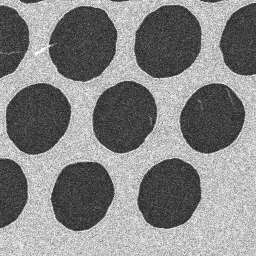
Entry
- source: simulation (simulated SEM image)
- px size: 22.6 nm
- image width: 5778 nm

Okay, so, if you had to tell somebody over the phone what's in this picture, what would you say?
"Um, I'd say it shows holes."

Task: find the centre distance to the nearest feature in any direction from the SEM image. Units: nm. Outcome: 1950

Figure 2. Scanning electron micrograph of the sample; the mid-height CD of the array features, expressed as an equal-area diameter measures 1530 nm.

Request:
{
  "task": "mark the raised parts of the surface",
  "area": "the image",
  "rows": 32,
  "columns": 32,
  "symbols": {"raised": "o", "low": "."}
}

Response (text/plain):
ooo.ooooooooooooooooooooooooooo.
..oooooo.....oooooo.....ooooo...
...oooo.......oooo.......ooo....
....ooo.......ooo........ooo....
....oo.........oo........ooo....
....oo.........oo........oo.....
...ooo........ooo........ooo....
...ooo........ooo.......oooo....
..ooooo......oooo.......ooooo...
.ooooooo....ooooooo...oooooooooo
oooo..ooooooooo...oooooooo..oooo
oo......ooooo......ooooo.....ooo
o........ooo.......oooo.......oo
o........ooo........ooo........o
o........ooo........oo.........o
o........ooo.......ooo........oo
o.......oooo.......oooo.......oo
o......ooooo......ooooo......ooo
oo....ooooooo....ooooooo....oooo
oooooooooooooooooooooooooooooooo
..ooooooo....ooooooo....oooooooo
...ooooo.....ooooo.......ooooooo
...oooo.......oooo.......ooooooo
...oooo.......ooo........ooooooo
....oo........ooo........ooooooo
...ooo........ooo........ooooooo
...oooo......ooooo......oooooooo
..ooooo......ooooo......oooooooo
oooooooo...ooooooooo.ooooooooooo
oooooooooooooooooooooooooooooooo
oooooooooooooooooooooooooooooooo
oooooooooooooooooooooooooooooooo